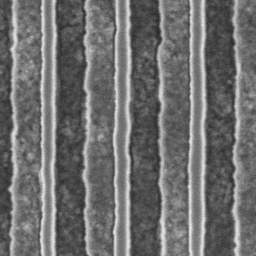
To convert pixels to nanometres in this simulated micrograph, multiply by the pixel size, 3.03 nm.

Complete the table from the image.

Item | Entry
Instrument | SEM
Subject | lines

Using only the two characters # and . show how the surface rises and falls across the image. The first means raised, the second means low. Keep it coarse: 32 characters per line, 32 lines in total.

..#####....#####....#####....###
..#####....#####....#####....###
..#####....#####....#####....###
..#####....#####....#####....###
..#####....#####....######...###
..#####....#####....#####.....##
..#####....#####....#####.....##
..#####....#####....#####.....##
..#####....#####....#####.....##
..#####....#####....#####.....##
..#####....#####....######....##
..#####....#####....######....##
.######....#####....######....##
..#####....#####....######....##
..#####....#####....######....##
..#####....#####....#####.....##
..#####....#####....#####.....##
..#####....#####....######....##
..#####....#####....######...###
..#####....#####....######...###
..#####....#####....#####....###
..#####....#####....#####.....##
..#####....#####....#####....###
.######....#####....#####....###
..#####....#####....#####....###
..#####....#####....#####....###
..#####....#####....#####....###
..#####....#####....#####....###
.######....#####....#####.....##
.######....#####....#####.....##
.######....#####....#####.....##
.######....#####....#####.....##